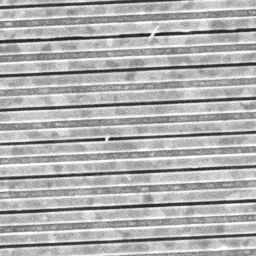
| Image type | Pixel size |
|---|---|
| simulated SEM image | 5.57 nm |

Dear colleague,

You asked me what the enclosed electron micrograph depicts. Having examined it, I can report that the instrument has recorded parallel lines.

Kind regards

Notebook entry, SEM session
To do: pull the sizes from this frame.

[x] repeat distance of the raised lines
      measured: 95.2 nm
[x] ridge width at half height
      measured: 59.2 nanometers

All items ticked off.